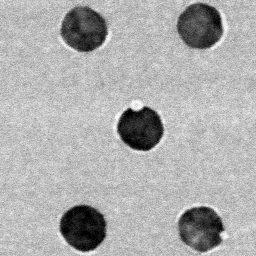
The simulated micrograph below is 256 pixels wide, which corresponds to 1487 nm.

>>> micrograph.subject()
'holes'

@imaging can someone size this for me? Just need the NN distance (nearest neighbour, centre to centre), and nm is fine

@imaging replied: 665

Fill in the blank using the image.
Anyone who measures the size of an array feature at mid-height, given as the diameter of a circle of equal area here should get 274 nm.